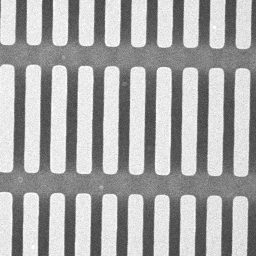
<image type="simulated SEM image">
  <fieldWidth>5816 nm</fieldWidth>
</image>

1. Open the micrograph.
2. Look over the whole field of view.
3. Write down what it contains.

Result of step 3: groups of lines, slits or small figures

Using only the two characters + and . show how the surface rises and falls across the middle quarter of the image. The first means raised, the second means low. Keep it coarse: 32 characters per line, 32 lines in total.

................................
+...+++...++++...+++...++++...++
+...+++...++++...+++...++++...++
+...+++...++++...+++...++++...++
+...+++...++++...+++...++++...++
+...+++...++++...+++...++++...++
+...+++...++++...+++...++++...++
+...+++...++++...+++...++++...++
+...+++...++++...+++...++++...++
+...+++...++++...+++...++++...++
....+++...++++...+++...++++...++
....+++...++++...+++...++++...++
....+++...++++...+++...++++...++
....+++...++++...+++...++++...++
....+++...+++....+++...++++...++
....+++...+++....+++...++++...++
....+++...+++....+++...++++...++
....+++...+++....+++...++++...++
....+++...+++....+++...++++...++
...++++...+++....+++...++++...++
...++++...+++....+++...++++...++
...++++...+++....+++...+++....++
...++++...+++....+++...+++....++
...++++...+++...++++...+++....++
...++++...+++...++++...+++....++
...++++...+++...++++...+++....++
...++++...+++...++++...+++....++
.................++....+++....++
................................
................................
................................
................................